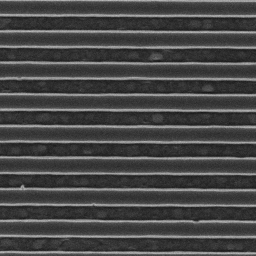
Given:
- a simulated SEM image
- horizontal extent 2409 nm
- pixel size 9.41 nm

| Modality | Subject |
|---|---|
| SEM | parallel lines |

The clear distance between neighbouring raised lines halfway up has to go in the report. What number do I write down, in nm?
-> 147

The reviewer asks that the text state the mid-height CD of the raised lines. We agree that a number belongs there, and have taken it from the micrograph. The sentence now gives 16.5 px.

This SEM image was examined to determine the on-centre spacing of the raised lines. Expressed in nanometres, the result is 297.